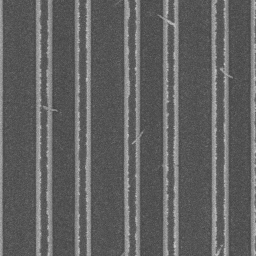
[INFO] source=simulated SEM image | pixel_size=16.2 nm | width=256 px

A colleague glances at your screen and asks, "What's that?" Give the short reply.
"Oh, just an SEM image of parallel lines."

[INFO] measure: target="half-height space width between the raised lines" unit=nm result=508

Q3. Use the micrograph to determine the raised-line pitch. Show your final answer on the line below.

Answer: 0.714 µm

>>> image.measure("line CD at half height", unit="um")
0.203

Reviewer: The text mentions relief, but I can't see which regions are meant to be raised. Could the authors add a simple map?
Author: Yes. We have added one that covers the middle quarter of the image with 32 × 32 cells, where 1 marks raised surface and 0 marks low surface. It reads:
00011100000000001110000001110000
00011100000000001100000001110000
00011100000000001100000001110000
00011100000000001100000001110000
00011100000000001100000001110000
00011100000000001100000001110000
00011100000000001100000001110000
00011100000000001100000001110000
00011100000000001110000001110000
00011100000000001100000001110000
00011100000000001100000001110000
00011100000000001100000001110000
00011100000000001100000001110000
00011100000000001100000001110000
00011100000000001100000001110000
00011100000000001100000001110000
00011100000000001100000001110000
00011100000000001110000001110000
00011100000000001110000001110000
00011100000000001100000001110000
00011100000000001100000001110000
00011100000000001100000001110000
00011100000000001100000001110000
00011100000000001100000001110000
00011100000000011100000001110000
00011100000000011100000001110000
00011100000000011100000001110000
00011100000000011100000001110000
00011100000000011100000001110000
00011100000000011100000001110000
00011100000000011100000001110000
00011100000000011100000001110000